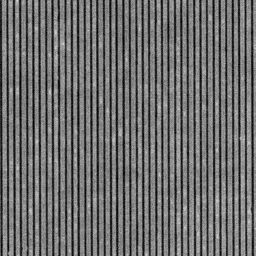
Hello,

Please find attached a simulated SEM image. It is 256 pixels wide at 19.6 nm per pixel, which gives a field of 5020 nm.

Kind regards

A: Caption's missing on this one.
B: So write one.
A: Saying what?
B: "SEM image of parallel lines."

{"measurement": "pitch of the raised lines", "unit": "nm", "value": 126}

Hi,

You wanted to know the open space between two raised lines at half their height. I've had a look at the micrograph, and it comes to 53.9 nanometers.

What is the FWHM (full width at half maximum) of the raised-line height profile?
68.6 nm